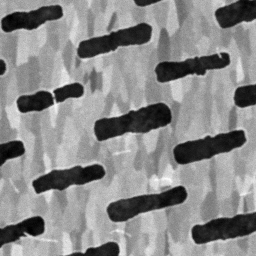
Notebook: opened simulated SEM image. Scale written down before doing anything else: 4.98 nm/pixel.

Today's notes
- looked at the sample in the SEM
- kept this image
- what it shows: holes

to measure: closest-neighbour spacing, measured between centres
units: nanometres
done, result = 400